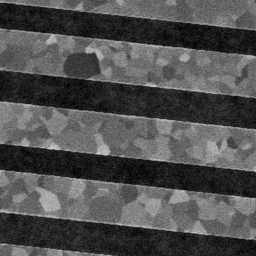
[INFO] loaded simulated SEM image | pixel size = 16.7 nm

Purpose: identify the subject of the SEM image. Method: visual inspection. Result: lines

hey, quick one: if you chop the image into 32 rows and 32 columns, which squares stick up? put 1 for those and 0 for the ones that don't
00011111111111111111111111111111
00000000000011111111111111111111
00000000000000000000011111111111
00000000000000000000000000000011
11111111100000000000000000000000
11111111111111111100000000000000
11111111111111111111111111100000
11111111111111111111111111111111
11111111111111111111111111111111
00000001111111111111111111111111
00000000000000001111111111111111
00000000000000000000000001111111
00000000000000000000000000000000
11111110000000000000000000000000
11111111111111110000000000000000
11111111111111111111111110000000
11111111111111111111111111111111
11111111111111111111111111111111
00000011111111111111111111111111
00000000000000011111111111111111
00000000000000000000000111111111
11000000000000000000000000000000
11111111111000000000000000000000
11111111111111111111000000000000
11111111111111111111111111111000
11111111111111111111111111111111
11111111111111111111111111111111
00000000011111111111111111111111
00000000000000000011111111111111
00000000000000000000000000011111
00000000000000000000000000000000
11111111100000000000000000000000